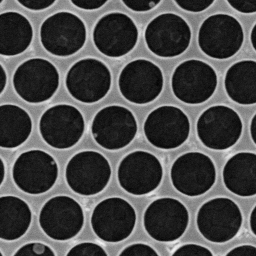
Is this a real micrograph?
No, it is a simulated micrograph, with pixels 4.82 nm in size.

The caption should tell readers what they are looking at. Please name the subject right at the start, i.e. a regular array of holes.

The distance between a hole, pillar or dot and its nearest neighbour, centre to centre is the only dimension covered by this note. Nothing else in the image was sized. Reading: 252 nanometres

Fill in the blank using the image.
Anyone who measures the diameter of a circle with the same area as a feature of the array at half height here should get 214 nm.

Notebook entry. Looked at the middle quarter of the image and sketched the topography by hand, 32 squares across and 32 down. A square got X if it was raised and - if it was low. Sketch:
XX--------XXXXX--------XXXXX----
X----------XXXX---------XXXX----
X-----------XX-----------XX-----
------------XX-----------XX-----
------------XX-----------XX-----
X-----------XX-----------XX-----
X----------XXX----------XXX-----
XX--------XXXX----------XXXX----
XXX------XXXXXX--------XXXXX----
XXXXX---XXXXXXXXX----XXXXXXXXX--
--XXXXXXXXXX-XXXXXXXXXXXX--XXXXX
---XXXXXX-------XXXXXXX------XXX
----XXXX---------XXXX---------XX
-----XXX----------XXX----------X
-----XX-----------XX-----------X
-----XX-----------XX-----------X
-----XX-----------XX-----------X
-----XX-----------XX-----------X
----XXXX---------XXXX----------X
---XXXXX---------XXXX---------XX
--XXXXXXX------XXXXXXXX------XXX
XXXXXXXXXXXX-XXXXXXXXXXXXXXXXXXX
XXX------XXXXXXX------XXXXXXXX--
XX--------XXXXX--------XXXXX----
X----------XXX----------XXXX----
X----------XXX----------XXX-----
------------X------------XX-----
------------X------------XX-----
X----------XXX-----------XX-----
X----------XXX----------XXX-----
X---------XXXX---------XXXX-----
XX--------XXXXX-------XXXXXX----